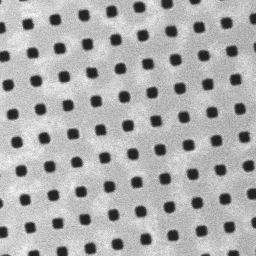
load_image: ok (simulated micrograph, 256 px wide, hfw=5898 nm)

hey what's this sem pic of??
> a regular array of holes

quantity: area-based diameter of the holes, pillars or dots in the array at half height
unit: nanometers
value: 288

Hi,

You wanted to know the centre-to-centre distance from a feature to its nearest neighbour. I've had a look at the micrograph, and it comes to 643 nm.